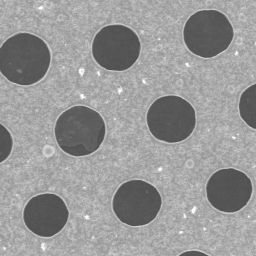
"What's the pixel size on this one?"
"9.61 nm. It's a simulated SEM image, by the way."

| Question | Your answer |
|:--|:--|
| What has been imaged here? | holes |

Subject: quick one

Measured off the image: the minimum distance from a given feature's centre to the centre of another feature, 0.871 um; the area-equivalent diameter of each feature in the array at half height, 456 nanometres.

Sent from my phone